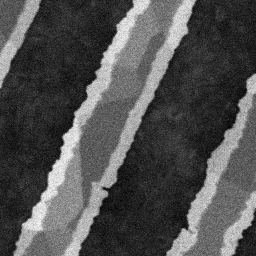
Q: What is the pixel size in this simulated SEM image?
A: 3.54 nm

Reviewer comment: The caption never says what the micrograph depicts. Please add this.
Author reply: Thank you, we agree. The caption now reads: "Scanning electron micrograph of one or a few lines or trenches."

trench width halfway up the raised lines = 334 nm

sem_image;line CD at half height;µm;0.168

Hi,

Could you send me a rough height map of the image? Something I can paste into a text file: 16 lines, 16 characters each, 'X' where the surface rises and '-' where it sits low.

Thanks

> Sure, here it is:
XX-------XXX----
X-------XXX-----
X-------XXX-----
-------XXX------
-------XXX------
------XXX-------
------XXX------X
-----XXX-------X
-----XXX-------X
----XXXX------XX
----XXX-------XX
---XXX-------XXX
---XXX-------XXX
--XXXX------XXXX
--XXX-------XXX-
-XXXX------XXX--